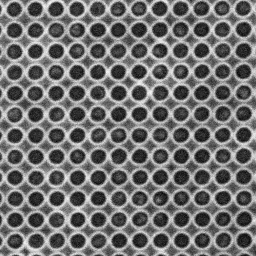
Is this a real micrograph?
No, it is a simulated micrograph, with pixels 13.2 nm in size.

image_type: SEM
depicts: a regular array of holes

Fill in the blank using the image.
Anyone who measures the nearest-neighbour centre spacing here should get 0.273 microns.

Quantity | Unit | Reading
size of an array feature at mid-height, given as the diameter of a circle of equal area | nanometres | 216